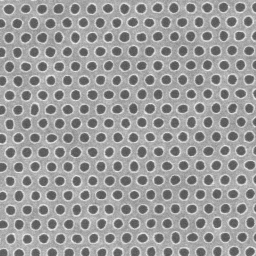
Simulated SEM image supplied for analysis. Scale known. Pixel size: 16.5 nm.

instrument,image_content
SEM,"a regular array of holes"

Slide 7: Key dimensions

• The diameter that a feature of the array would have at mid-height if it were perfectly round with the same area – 164 nanometers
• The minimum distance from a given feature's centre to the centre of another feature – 264 nanometers